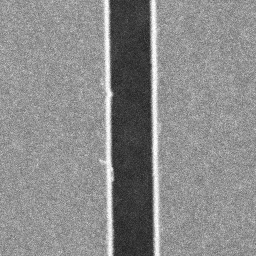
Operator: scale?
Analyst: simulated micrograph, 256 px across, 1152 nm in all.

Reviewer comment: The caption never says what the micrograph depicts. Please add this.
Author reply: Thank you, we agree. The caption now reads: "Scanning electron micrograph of one or a few lines or trenches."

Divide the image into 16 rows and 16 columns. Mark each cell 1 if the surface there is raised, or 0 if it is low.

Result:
1111111000111111
1111111000111111
1111111000111111
1111111000111111
1111111000111111
1111111000111111
1111111000111111
1111111000111111
1111111000111111
1111111000111111
1111111000111111
1111111000111111
1111111000111111
1111111000111111
1111111000111111
1111111000111111